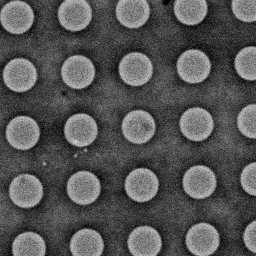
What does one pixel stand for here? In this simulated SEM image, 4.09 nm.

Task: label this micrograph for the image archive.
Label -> an array of small figures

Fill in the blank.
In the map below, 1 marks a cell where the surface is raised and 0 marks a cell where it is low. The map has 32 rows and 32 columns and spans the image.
01100000111000011100001111000111
11110001111000011110001111000111
11110001111000011100001110000011
01110000110000000000000000000000
00000000000000000000000000000000
00000000000000000000000000000000
00000000000000000000000110000011
00100000111000011110001111000111
01110000111100011110001111000111
11111000111100011110000111000011
01110000111000001100000000000000
00000000000000000000000000000000
00000000000000000000000000000000
00000000000000000000000000000001
00000000011000001110000111000011
01111000111100011110000111100011
01111000111100011110000111000011
01111000011100001110000010000000
00110000000000000000000000000000
00000000000000000000000000000000
00000000000000000000000000000001
00000000001000000110000111000011
00111000011100001111000111100011
01111000111100001111000111100011
01111000011100001110000011000000
00110000001000000000000000000000
00000000000000000000000000000000
00000000000000000000000000000000
00000000000000000110000011100001
00111000011100001111000111100001
00111100011110001111000111100001
00111100011110001111000011100000